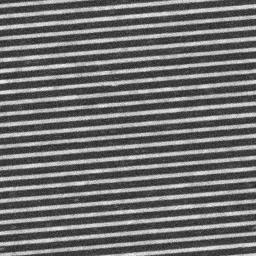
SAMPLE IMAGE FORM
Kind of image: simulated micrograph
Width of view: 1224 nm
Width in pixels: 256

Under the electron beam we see parallel lines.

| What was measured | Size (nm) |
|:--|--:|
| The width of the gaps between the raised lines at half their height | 33.9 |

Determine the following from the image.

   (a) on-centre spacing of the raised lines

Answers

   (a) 51.6 nm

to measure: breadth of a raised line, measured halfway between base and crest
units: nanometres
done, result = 16.7